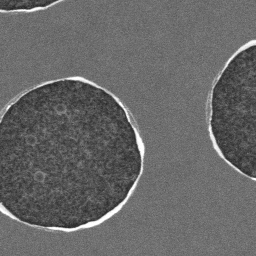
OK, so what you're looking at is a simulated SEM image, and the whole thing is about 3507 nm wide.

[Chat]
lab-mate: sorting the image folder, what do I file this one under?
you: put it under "holes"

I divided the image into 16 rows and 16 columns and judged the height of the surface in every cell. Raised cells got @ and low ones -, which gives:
--@@@@@@@@@@@@@@
@@@@@@@@@@@@@@@@
@@@@@@@@@@@@@@@@
@@@@@@@@@@@@@@@-
@@@@@@@@@@@@@@--
@@----@@@@@@@---
@------@@@@@@---
--------@@@@@---
--------@@@@@---
---------@@@@@--
---------@@@@@@-
--------@@@@@@@@
--------@@@@@@@@
@-----@@@@@@@@@@
@@@@@@@@@@@@@@@@
@@@@@@@@@@@@@@@@